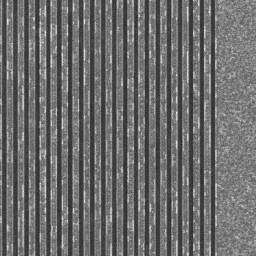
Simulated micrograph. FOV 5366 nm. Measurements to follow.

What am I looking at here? parallel lines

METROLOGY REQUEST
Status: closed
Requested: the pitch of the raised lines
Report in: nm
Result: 230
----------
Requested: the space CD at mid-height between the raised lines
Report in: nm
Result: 107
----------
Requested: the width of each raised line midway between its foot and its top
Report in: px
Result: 6